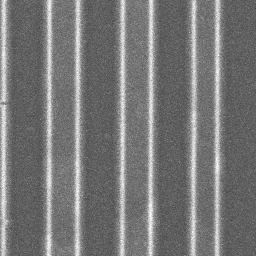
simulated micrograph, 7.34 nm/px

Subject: one or a few lines or trenches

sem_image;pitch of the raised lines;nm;522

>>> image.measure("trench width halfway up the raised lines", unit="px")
45.1